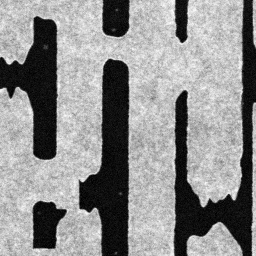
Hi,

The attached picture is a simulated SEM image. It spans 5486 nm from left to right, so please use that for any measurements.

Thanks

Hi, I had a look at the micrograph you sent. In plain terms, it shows one or a few lines or trenches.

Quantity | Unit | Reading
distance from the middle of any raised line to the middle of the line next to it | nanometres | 1420